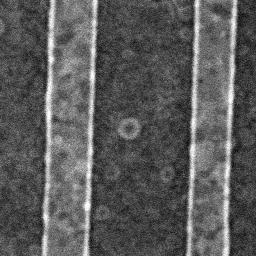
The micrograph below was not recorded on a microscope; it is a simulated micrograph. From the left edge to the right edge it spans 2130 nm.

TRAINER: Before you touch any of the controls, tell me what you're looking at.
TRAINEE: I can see one or a few lines or trenches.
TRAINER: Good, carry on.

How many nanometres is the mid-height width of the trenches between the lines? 848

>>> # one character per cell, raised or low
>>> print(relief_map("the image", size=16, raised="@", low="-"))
---@@@------@@@-
---@@@------@@@-
---@@@------@@@-
---@@@------@@@-
---@@@------@@@-
---@@@------@@--
---@@@------@@--
---@@@------@@--
---@@@------@@--
---@@@------@@--
---@@@------@@--
---@@@------@@--
---@@@------@@--
---@@-------@@--
---@@-------@@--
---@@-------@@--